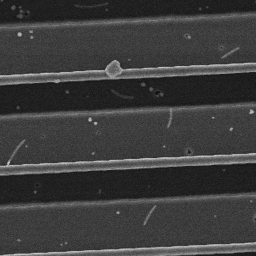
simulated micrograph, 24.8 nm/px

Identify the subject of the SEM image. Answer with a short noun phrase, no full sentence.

lines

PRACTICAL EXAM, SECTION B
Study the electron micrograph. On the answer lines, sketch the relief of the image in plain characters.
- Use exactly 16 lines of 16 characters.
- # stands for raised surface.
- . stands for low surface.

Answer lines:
................
.....###########
################
################
################
................
................
################
################
################
#########.......
................
..........######
################
################
################